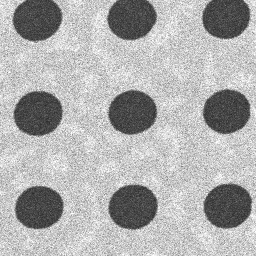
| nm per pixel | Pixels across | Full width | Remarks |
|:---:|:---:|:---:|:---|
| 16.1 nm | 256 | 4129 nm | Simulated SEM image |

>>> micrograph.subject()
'holes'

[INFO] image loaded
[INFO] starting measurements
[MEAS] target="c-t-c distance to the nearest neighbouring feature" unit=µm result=1.52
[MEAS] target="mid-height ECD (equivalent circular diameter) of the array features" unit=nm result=758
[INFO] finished